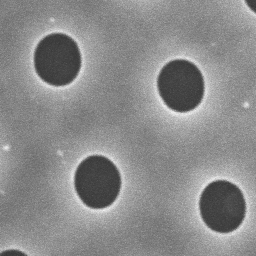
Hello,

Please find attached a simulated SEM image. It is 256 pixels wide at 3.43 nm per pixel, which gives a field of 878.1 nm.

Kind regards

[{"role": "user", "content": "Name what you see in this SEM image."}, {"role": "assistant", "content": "holes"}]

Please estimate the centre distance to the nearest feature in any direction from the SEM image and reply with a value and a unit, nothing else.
0.435 micrometres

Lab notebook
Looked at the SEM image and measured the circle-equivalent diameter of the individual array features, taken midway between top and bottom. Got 175 nm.